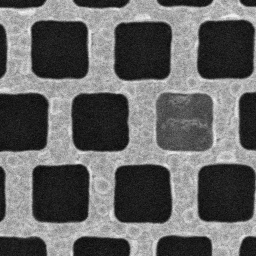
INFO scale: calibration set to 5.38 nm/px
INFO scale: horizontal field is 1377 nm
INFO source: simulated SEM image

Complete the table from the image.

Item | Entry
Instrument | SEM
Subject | holes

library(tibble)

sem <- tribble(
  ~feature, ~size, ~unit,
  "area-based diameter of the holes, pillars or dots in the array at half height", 344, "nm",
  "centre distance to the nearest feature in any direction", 446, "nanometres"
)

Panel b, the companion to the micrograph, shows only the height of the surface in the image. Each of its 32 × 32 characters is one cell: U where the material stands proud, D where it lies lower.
DDDDDUUUUDDDDDDDUUUUDDDDDDUUUUDD
UUUUUUUUUUUUUUUUUUUUUUUUUUUUUUUU
UUUUUUUUUUUUUUUUUUUUUUUUUUUUUDUU
DUUUDDDDDDDUUUDDDDDDDUUUUDDDDDDD
DUUUDDDDDDDUUUDDDDDDDDUUUDDDDDDD
DUUUDDDDDDDUUUDDDDDDDUUUUDDDDDDD
DUUUDDDDDDDUUUDDDDDDDUUUUDDDDDDD
DUUUDDDDDDDUUUDDDDDDDUUUUDDDDDDD
DUUUDDDDDDDUUUDDDDDDDUUUUDDDDDDD
UUUUUDDDDDDUUUUDDDDDDUUUUDDDDDDU
UUUUUUUUUUUUUUUUUUUUUUUUUUUUUUUU
UUUUUUUUUUUUUUUUUUUUUUUUUUUUUUUD
DDDDDDUUUDDDDDDDUUUUDDDDDDDUUUDD
DDDDDDUUUDDDDDDDUUUDDDDDDDDUUUDD
DDDDDDUUUDDDDDDDUUUUDDDDDDDUUUDD
DDDDDDUUUDDDDDDDUUUDDDDDDDDUUUDD
DDDDDDUUUDDDDDDDUUUDDDDDDDDUUUDD
DDDDDDUUUDDDDDDDUUUUDDDDDDDUUUDD
DDDDDUUUUUDDDDDDUUUUDDDDDDUUUUUD
UUUUUUUUUUUUUUUUUUUUUUUUUUUUUUUU
UUUUUUUUDDUUUUUUUUUUUUUUUUDDDDUU
DUUUDDDDDDDUUUDDDDDDDUUUUDDDDDDD
DUUUDDDDDDDUUUDDDDDDDUUUUDDDDDDD
DUUUDDDDDDDUUUDDDDDDDUUUUDDDDDDD
DUUUDDDDDDDUUUDDDDDDDUUUUDDDDDDD
DUUUDDDDDDDUUUDDDDDDDDUUUDDDDDDD
DUUUDDDDDDDUUUDDDDDDDUUUUDDDDDDD
UUUUUDDDDDDUUUUDDDDDDUUUUDDDDDDU
UUUUUUUUUUUUUUUUUUUUUUUUUUUUUUUU
UUUUUUUUUUUUUUUUUUUUUDUUDUUUUUUU
DDDDDDUUUDDDDDDDUUUUDDDDDDUUUUDD
DDDDDDUUUDDDDDDDUUUDDDDDDDDUUUDD